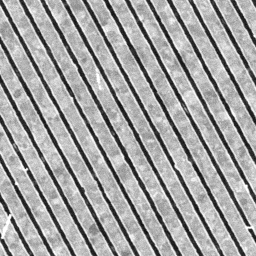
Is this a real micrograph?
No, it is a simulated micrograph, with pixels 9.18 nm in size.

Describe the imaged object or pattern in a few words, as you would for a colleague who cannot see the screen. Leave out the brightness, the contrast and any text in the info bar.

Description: parallel lines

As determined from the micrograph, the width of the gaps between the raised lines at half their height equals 48.5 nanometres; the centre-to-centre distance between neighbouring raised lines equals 171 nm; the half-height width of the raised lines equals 0.124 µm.